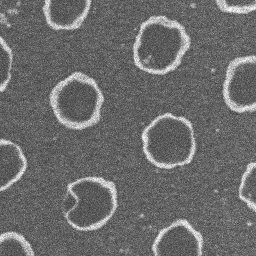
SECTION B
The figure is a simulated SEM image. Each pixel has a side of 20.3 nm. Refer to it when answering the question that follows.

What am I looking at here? raised bodies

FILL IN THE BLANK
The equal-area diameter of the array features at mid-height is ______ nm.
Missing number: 1020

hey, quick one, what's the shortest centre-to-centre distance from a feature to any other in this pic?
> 1.99 micrometres